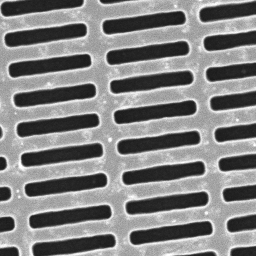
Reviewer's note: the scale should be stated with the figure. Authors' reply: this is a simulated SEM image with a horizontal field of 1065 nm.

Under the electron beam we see a regular array of holes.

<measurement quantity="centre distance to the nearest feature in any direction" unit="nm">125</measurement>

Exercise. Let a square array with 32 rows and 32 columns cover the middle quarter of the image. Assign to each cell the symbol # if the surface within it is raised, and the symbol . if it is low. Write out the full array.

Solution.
......##########################
..##############################
#######################.........
################................
############....................
##......###..................###
........####..........##########
........########################
.......#########################
#############################...
####################............
##############..................
#####...#####...................
.........####............#######
.........####......#############
........########################
..##############################
##########################......
###################.............
##############..................
#.#......####.................##
..........###..........#########
..........####..#.##############
.......#########################
.###############################
#######################.........
##################..............
#######...#####.................
...........###...............###
...........####.......##########
..........######################
.....###########################